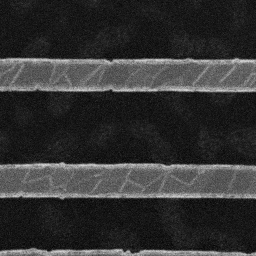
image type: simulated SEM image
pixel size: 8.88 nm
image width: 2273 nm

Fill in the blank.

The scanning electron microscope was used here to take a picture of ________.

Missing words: one or a few lines or trenches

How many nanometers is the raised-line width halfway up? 275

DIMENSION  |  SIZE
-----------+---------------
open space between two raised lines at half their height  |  582 nanometers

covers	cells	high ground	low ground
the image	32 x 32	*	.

................................
................................
................................
................................
................................
................................
................................
..*....................*........
********************************
********************************
********************************
................................
................................
................................
................................
................................
................................
................................
................................
................................
................................
********************************
********************************
********************************
......**************************
................................
................................
................................
................................
................................
................................
******.*********...**..*........